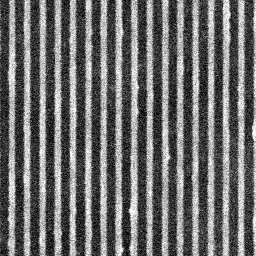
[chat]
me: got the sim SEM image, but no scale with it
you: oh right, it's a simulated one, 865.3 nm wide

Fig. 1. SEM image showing parallel lines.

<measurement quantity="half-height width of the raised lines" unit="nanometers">16.5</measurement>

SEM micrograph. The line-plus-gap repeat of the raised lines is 51.7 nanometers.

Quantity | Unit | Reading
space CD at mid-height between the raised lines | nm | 32.9